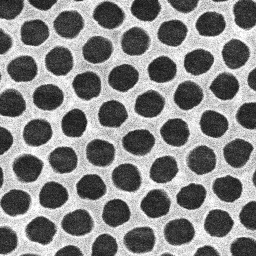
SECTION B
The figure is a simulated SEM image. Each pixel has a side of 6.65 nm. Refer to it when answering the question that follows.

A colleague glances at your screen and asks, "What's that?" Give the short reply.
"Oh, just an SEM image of a regular array of holes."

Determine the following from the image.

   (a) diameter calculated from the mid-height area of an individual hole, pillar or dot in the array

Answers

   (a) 190 nm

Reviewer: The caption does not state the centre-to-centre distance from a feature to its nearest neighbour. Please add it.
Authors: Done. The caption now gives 36.7 px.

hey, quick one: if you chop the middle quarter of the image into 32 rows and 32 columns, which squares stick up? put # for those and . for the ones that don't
..###########....####.......##..
..##########......###.......##..
.###....###........##.......####
###......##........##......#####
##.......##.......#####..#####..
##.......###.....###########....
###......####...#####.######....
###......##########.....####....
####...###########.......##.....
##########....####.......###....
#########......###.......####...
##..#####.......##.......#####.#
.....###........###.....########
......###.......#####.######.###
......###......##########.....##
......#####...##########.......#
.....#############...###.......#
.....###########......##.......#
###############........##......#
######.....###.........##.....##
######......###.......#####..###
...##........##.......##########
...##........####....##########.
...###......###########....####.
...####.....##########......###.
...#####...###....####......###.
..##########......###........###
######.#####.......##.......####
####.....###.......##......#####
###.......##.......####...######
###........##......###########..
.##........####...####..#####...